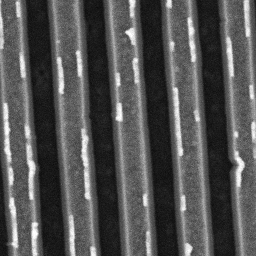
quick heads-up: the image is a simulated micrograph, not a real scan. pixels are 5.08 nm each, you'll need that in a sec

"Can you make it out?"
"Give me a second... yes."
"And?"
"parallel lines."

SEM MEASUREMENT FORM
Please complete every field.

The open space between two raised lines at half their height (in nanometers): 147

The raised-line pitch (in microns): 0.288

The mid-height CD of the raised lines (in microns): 0.142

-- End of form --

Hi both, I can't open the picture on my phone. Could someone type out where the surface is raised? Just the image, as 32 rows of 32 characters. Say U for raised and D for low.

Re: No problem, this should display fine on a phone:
UUUDDDUUUUDDDUUUUDDDDUUUDDDDUUUD
UUUDDDDUUUDDDDUUUDDDDUUUDDDDUUUD
UUUDDDDUUUDDDDUUUDDDDUUUDDDDUUUD
UUUDDDDUUUDDDDUUUDDDDUUUDDDDUUUD
UUUDDDDUUUDDDDUUUDDDDUUUDDDDUUUD
UUUDDDDUUUDDDDUUUDDDDUUUDDDDUUUU
UUUDDDDUUUDDDDUUUDDDDUUUUDDDUUUU
UUUDDDDUUUDDDDUUUDDDDUUUUDDDUUUU
UUUDDDDUUUDDDDUUUDDDDUUUUDDDUUUU
UUUDDDDUUUUDDDUUUDDDDUUUUDDDUUUU
UUUDDDDUUUUDDDUUUUDDDUUUUDDDDUUU
UUUUDDDUUUUDDDUUUUDDDUUUUDDDDUUU
UUUUDDDUUUUDDDUUUUDDDDUUUDDDDUUU
UUUUDDDUUUUDDDUUUUDDDDUUUDDDDUUU
UUUUDDDUUUUDDDUUUUDDDDUUUDDDDUUU
UUUUDDDUUUUDDDDUUUDDDDUUUDDDDUUU
UUUUDDDUUUUDDDDUUUDDDDUUUDDDDUUU
UUUUDDDDUUUDDDDUUUDDDDUUUDDDDUUU
DUUUDDDDUUUDDDDUUUDDDDUUUDDDDUUU
DUUUDDDDUUUDDDDUUUDDDDUUUDDDDUUU
DUUUDDDDUUUDDDDUUUDDDDUUUDDDDUUU
DUUUDDDDUUUDDDDUUUDDDDUUUUDDDUUU
DUUUDDDDUUUDDDDUUUUDDDUUUUDDDUUU
DUUUDDDDUUUDDDDUUUUDDDUUUUDDDUUU
DUUUDDDDUUUUDDDUUUUDDDUUUUDDDUUU
DUUUDDDDUUUUDDDUUUUDDDUUUUDDDUUU
DUUUUDDDUUUUDDDUUUUDDDUUUUDDDDUU
DUUUUDDDUUUUDDDUUUUDDDDUUUDDDDUU
DUUUUDDDDUUUDDDDUUUDDDDUUUDDDDUU
DUUUUDDDDUUUDDDDUUUDDDDUUUDDDDUU
DUUUUDDDDUUUDDDDUUUDDDDUUUDDDDUU
DDUUUDDDDUUUDDDDUUUDDDDUUUDDDDUU